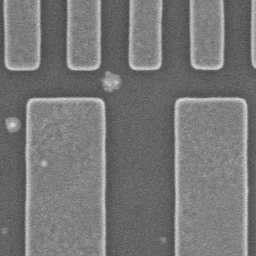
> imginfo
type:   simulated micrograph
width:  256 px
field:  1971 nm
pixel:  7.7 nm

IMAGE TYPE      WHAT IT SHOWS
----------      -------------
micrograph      wiring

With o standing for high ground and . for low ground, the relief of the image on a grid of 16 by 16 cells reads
oo..oo..oo..oo..
ooo.oo..oo..oo..
ooo.oo..oo..oo..
oo..oo..oo..oo..
................
................
..oooo.....oooo.
..ooooo....oooo.
..ooooo....oooo.
..ooooo....oooo.
..ooooo....oooo.
..ooooo....oooo.
..oooo.....oooo.
..ooooo....oooo.
..ooooo....oooo.
..ooooo....oooo.